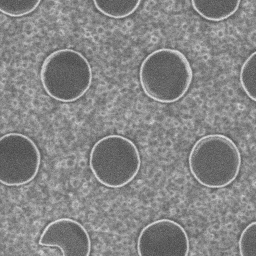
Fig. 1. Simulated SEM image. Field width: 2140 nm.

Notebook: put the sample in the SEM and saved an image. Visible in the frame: raised bodies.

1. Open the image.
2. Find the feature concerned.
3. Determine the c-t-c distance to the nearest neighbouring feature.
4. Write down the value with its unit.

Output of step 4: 97.6 px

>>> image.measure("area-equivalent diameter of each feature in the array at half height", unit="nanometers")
415